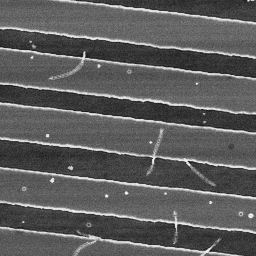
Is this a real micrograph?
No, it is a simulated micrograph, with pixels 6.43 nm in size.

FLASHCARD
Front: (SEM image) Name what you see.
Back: lines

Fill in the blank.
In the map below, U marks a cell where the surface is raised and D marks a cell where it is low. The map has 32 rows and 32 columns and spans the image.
UUUUUUUUUUUUUDDDDDDDDDDDDDDDDDDD
UUUUUUUUUUUUUUUUUUUUUDDDDDDDDDDD
UUUUUUUUUUUUUUUUUUUUUUUUUUUUUDDD
UUUUUUUUUUUUUUUUUUUUUUUUUUUUUUUU
DDDDDDDDUUUUUUUUUUUUUUUUUUUUUUUU
DDDDDDDDDDDDDDDDDUUUUUUUUUUUUUUU
UUUUUDDDDDDDDDDDDDDDDDDDDDUUUUUU
UUUUUUUUUUUUDDDDDDDDDDDDDDDDDDDD
UUUUUUUUUUUUUUUUUUUUUUDDDDDDDDDD
UUUUUUUUUUUUUUUUUUUUUUUUUUUUUUDD
UUUUUUUUUUUUUUUUUUUUUUUUUUUUUUUU
DDDDDDDDDUUUUUUUUUUUUUUUUUUUUUUU
DDDDDDDDDDDDDDDDDUUUUUUUUUUUUUUU
UUUUUDDDDDDDDDDDDDDDDDDDUUUUUUUU
UUUUUUUUUUUUUUDDDDDDDDDDDDDDDDDD
UUUUUUUUUUUUUUUUUUUUUUDDDDDDDDDD
UUUUUUUUUUUUUUUUUUUUUUUUUUUUUUUD
DUUUUUUUUUUUUUUUUUUUUUUUUUUUUUUU
DDDDDDDDDDUUUUUUUUUUUUUUUUUUUUUU
DDDDDDDDDDDDDDDDDDUUUUUUUUUUUUUU
DDDDDDDDDDDDDDDDDDDDDDDDDDUUUUUU
UUUUDDDDDDDDDDDDDDDDDDDDDDDDDDDD
UUUUUUUUUUUUUDDDDDDDDDDDDDDDDDDD
UUUUUUUUUUUUUUUUUUUUUDDDDDDDDDDD
UUUUUUUUUUUUUUUUUUUUUUUUUUUUUUDD
DUUUUUUUUUUUUUUUUUUUUUUUUUUUUUUU
DDDDDDDDDUUUUUUUUUUUUUUUUUUUUUUU
DDDDDDDDDDDDDDDDDDUUUUUUUUUUUUUU
UDDDDDDDDDDDDDDDDDDDDDDDDDUUUUUU
UUUUUUUUUDDDDDDDDDDDDDDDDDDDDDDD
UUUUUUUUUUUUUUUUUUDDDDDDDDDDDDDD
UUUUUUUUUUUUUUUUUUUUUUUUUUUDDDDD